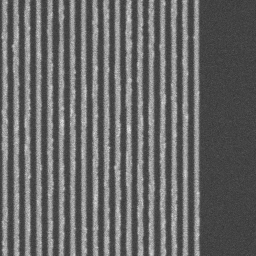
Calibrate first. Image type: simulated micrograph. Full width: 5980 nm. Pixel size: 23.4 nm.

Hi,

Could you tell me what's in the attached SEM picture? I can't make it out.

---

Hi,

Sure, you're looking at parallel lines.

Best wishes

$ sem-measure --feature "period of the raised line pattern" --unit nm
263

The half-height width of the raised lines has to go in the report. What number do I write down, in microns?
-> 0.184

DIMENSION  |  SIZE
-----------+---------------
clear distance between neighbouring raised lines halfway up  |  0.0788 um